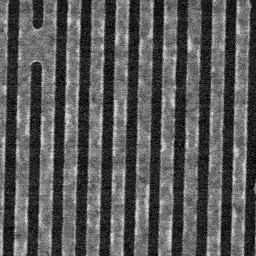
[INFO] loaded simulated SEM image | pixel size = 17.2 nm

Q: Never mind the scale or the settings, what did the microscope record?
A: parallel lines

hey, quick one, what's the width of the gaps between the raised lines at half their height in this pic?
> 208 nanometers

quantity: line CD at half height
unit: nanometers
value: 208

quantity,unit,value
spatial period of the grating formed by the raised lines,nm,414